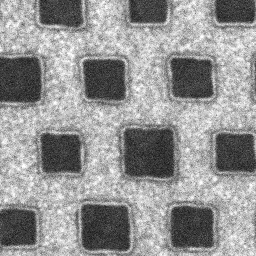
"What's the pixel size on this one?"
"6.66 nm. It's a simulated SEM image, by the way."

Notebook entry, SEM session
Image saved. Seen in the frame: raised bodies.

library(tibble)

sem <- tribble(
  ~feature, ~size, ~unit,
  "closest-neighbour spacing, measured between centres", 571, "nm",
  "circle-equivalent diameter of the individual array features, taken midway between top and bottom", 0.333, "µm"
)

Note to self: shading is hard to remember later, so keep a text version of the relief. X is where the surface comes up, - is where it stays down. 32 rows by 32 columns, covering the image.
-----XXXXXX-----XXXXX------XXXXX
-----XXXXXX-----XXXXX------XXXXX
-----XXXXXX-----XXXXX------XXXXX
-------XXX----------------------
--------------------------------
--------------------------------
--------------------------------
XXXXX-----XXXXX------XXXXX------
XXXXX-----XXXXXX-----XXXXXX-----
XXXXX-----XXXXXX-----XXXXXX-----
XXXXX-----XXXXXX-----XXXXXX-----
XXXXX-----XXXXXX-----XXXXXX-----
XXXXX------XXXXX---------X------
--------------------------------
--------------------------------
--------------------------------
-----XX--------XXXXXXX-----XX---
-----XXXXX-----XXXXXXX-----XXXXX
-----XXXXX-----XXXXXXX-----XXXXX
-----XXXXX-----XXXXXXX-----XXXXX
-----XXXXX-----XXXXXXX-----XXXXX
-----XXXXX-----XXXXXXX-----XXXXX
--------------------------------
--------------------------------
--------------------------------
----------XXXXX-----------------
XXXX------XXXXXX-----XXXXXX-----
XXXXX-----XXXXXX-----XXXXXX-----
XXXXX-----XXXXXX-----XXXXXX-----
XXXXX-----XXXXXXX----XXXXXX-----
XXXXX-----XXXXXXX----XXXXXX-----
------------XXX-----------------